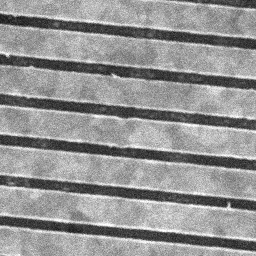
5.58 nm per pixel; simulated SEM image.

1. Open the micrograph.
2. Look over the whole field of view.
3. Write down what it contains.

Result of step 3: parallel lines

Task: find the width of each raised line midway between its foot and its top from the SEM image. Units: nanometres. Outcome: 157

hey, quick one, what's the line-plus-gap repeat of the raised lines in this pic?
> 0.224 µm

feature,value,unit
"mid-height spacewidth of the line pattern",65.9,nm